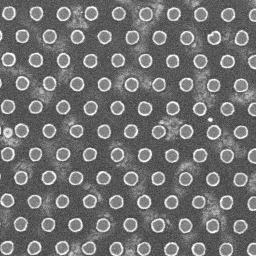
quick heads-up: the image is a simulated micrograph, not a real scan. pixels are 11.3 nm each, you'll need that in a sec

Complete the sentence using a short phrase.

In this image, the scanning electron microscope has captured a regular array of raised bodies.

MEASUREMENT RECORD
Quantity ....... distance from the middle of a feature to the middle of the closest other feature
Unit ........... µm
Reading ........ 0.304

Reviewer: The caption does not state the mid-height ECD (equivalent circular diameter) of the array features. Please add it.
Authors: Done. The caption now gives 147 nanometres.